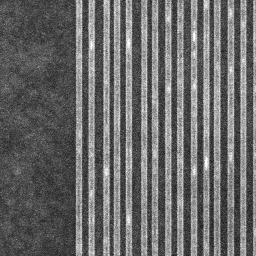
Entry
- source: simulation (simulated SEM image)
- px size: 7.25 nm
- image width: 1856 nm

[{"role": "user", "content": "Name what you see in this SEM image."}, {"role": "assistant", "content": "parallel lines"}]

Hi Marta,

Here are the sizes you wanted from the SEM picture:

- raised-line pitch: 91.5 nm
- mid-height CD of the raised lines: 38.9 nanometres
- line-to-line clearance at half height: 53.4 nm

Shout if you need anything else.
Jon